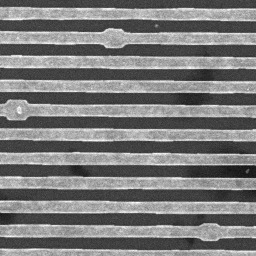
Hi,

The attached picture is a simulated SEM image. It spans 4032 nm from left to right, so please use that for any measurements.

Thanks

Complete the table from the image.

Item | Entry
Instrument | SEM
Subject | wiring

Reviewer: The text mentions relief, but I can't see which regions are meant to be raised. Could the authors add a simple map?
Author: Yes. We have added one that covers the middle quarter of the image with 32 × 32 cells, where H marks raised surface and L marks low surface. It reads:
HHHHHHHHHHHHHHHHHHHHHHHHHHHHHHHH
LLLLLLLLLLLLLLLLLLLLLLLLLLLLLLLL
LLLLLLLLLLLLLLLLLLLLLLLLLLLLLLLL
LLLLLLLLLLLLLLLLLLLLLLLLLLLLLLLL
HHHHHHHHHHHHHHHHHHHHHHHHHHHHHHHH
HHHHHHHHHHHHHHHHHHHHHHHHHHHHHHHH
HHHHHHHHHHHHHHHHHHHHHHHHHHHHHHHH
LLLLLLLLLLLLLLLLLLLLLLLLLLLLLLLL
LLLLLLLLLLLLLLLLLLLLLLLLLLLLLLLL
LLLLLLLLLLLLLLLLLLLLLLLLLLLLLLLL
HHHHHHHHHHHHHHHHHHHHHHHHHHHHLLLL
HHHHHHHHHHHHHHHHHHHHHHHHHHHHHHHH
HHHHHHHHHHHHHHHHHHHHHHHHHHHHHHHH
LLLLLLLLLLLLLLLLLLLLLLLLLLLLLLLL
LLLLLLLLLLLLLLLLLLLLLLLLLLLLLLLL
LLLLLLLLLLLLLLLLLLLLLLLLLLLLLLLL
HHHHHHHHHHHHHHHHHHHHHHHHHHHHHHHL
HHHHHHHHHHHHHHHHHHHHHHHHHHHHHHHH
HHHHHHHHHHHHHHHHHHHHHHHHHHHHHHHH
LLLLLLLLLLLLLLLLLLLLLLLLLLLLLLLL
LLLLLLLLLLLLLLLLLLLLLLLLLLLLLLLL
LLLLLLLLLLLLLLLLLLLLLLLLLLLLLLLL
HHHHHHHHHHHHHHHLLLLLLLLLLLLLLLLL
HHHHHHHHHHHHHHHHHHHHHHHHHHHHHHHH
HHHHHHHHHHHHHHHHHHHHHHHHHHHHHHHH
LLLLLLLLLLLLLLLLLLLLLLLLLLLLLLLL
LLLLLLLLLLLLLLLLLLLLLLLLLLLLLLLL
LLLLLLLLLLLLLLLLLLLLLLLLLLLLLLLL
HHHHHHHHHHHHHHHHHLLLLHHHHHLLLLLL
HHHHHHHHHHHHHHHHHHHHHHHHHHHHHHHH
HHHHHHHHHHHHHHHHHHHHHHHHHHHHHHHH
LLLLLLLLLLLLLLLLLLLLLLLLLLLLLLLL